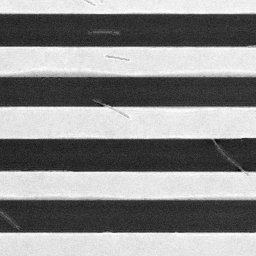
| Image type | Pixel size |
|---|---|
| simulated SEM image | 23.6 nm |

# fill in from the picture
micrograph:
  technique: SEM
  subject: lines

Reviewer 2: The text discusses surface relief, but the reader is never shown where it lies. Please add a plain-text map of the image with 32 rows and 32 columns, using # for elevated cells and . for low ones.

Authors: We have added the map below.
################################
################################
................................
................................
................................
................................
################################
################################
################################
................................
................................
................................
................................
##################.........##...
################################
################################
################################
................................
................................
................................
................................
..............................#.
################################
################################
################################
................................
................................
................................
................................
################################
################################
################################